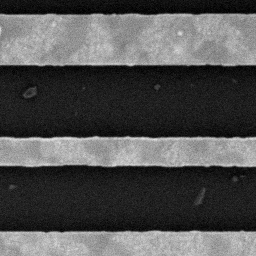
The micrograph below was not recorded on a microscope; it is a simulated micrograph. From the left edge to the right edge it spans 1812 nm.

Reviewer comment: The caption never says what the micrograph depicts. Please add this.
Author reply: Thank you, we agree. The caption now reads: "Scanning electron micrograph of lines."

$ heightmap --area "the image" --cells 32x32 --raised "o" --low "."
................................
................................
oooooooooooooooooooooooooooooooo
oooooooooooooooooooooooooooooooo
oooooooooooooooooooooooooooooooo
oooooooooooooooooooooooooooooooo
oooooooooooooooooooooooooooooooo
oooooooooooooooooooooooooooooooo
................................
................................
................................
................................
................................
................................
................................
................................
................................
oooooooooooooooooooooooooooooooo
oooooooooooooooooooooooooooooooo
oooooooooooooooooooooooooooooooo
oooooooooooooooooooooooooooooooo
................................
................................
................................
................................
................................
................................
................................
................................
oooooooooooooooooooooooooooooooo
oooooooooooooooooooooooooooooooo
oooooooooooooooooooooooooooooooo